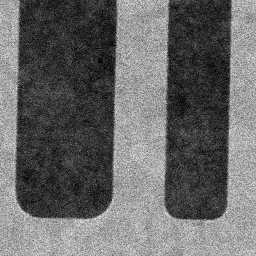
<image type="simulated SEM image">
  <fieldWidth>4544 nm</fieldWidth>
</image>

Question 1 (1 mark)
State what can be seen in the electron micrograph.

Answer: one or a few lines or trenches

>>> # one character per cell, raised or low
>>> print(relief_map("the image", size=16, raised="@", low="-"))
@------@@@-----@
@------@@@-----@
@------@@@----@@
@------@@@----@@
@------@@@----@@
@------@@@----@@
@------@@@----@@
@------@@@----@@
@------@@@----@@
@------@@@----@@
@------@@@----@@
@------@@@----@@
@------@@@----@@
@@----@@@@@---@@
@@@@@@@@@@@@@@@@
@@@@@@@@@@@@@@@@